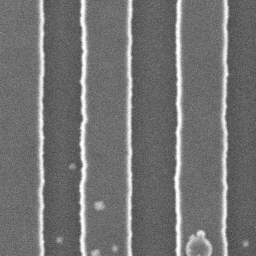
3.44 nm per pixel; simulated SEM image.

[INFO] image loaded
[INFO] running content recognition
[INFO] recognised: lines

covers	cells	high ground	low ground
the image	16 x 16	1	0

1110011100011100
1110011100011100
1110011100011100
1110011100011100
1110011100011100
1110011100011100
1110011100011100
1110011100011100
1110011100011100
1110011100011100
1110011100011100
1110011100011100
1110011100011100
1110011100011100
1110011100011100
1110011100011100